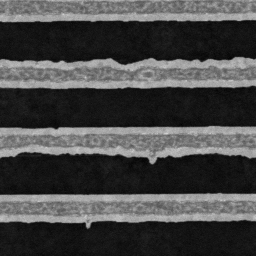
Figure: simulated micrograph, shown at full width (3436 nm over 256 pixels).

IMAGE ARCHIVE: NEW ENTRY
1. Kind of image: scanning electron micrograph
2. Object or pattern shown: one or a few lines or trenches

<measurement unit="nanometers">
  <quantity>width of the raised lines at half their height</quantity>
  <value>280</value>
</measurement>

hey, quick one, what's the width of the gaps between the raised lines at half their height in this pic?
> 609 nm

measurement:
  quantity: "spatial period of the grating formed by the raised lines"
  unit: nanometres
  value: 898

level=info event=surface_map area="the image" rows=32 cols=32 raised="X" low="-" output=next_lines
XXXXXXXXXXXXXXXXXXXXXXXXXXXXXXXX
XXXXXXXXXXXXXXXXXXXXXXXXXXXXXXXX
--------------------------------
--------------------------------
--------------------------------
--------------------------------
--------------------------------
--------------------------------
XXXXXXXXXXXXXXXXXXXXXXXXXXXXXXXX
XXXXXXXXXXXXXXXXXXXXXXXXXXXXXXXX
-XXXXXXXXXXXXXXX-------XX-------
--------------------------------
--------------------------------
--------------------------------
--------------------------------
--------------------------------
XXX--XXXXXXXXXXXXXXXXXXXXXXXXXXX
XXXXXXXXXXXXXXXXXXXXXXXXXXXXXXXX
XXXXXXXXXXXXXXXXXXXXXXXXXXXXXXXX
------------------XX------------
--------------------------------
--------------------------------
--------------------------------
--------------------------------
--------------------------------
XXXXXXXXXXXXXXXXXXXXXXXXXXXXXXXX
XXXXXXXXXXXXXXXXXXXXXXXXXXXXXXXX
--------X-XX--------------------
--------------------------------
--------------------------------
--------------------------------
--------------------------------